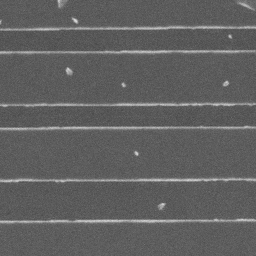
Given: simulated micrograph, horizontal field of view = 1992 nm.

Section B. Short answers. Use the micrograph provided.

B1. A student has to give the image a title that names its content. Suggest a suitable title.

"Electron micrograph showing lines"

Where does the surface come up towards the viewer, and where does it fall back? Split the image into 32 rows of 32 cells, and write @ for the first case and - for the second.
@@@@@@@@@@@@@@@@@@@@@@@@@@@@@@@@
@@@@@@@@@@@@@@@@@@@@@@@@@@@@@@@@
@@@@@@@@@@@@@@@@@@@@@@@@@@@@@@@@
@@@@@@@@@@@@@@@@@@@@------------
--------------------------------
--------------------------------
--------------------@@@@@@@@@@@@
@@@@@@@@@@@@@@@@@@@@@@@@@@@@@@@@
@@@@@@@@@@@@@@@@@@@@@@@@@@@@@@@@
@@@@@@@@@@@@@@@@@@@@@@@@@@@@@@@@
@@@@@@@@@@@@@@@@@@@@@@@@@@@@@@@@
@@@@@@@@@@@@@@@@@@@@@@@@@@@@@@@@
@@@@@@@@@@@@@@@@@@@@@@@@@@@@@@@@
--------------------------------
--------------------------------
--------------------------------
@@@@@@@@@@@@@@@@@@@@@@@@@@@@@@@@
@@@@@@@@@@@@@@@@@@@@@@@@@@@@@@@@
@@@@@@@@@@@@@@@@@@@@@@@@@@@@@@@@
@@@@@@@@@@@@@@@@@@@@@@@@@@@@@@@@
@@@@@@@@@@@@@@@@@@@@@@@@@@@@@@@@
@@@@@@@@@@@@@@@@@@@@@@@@@@@@@@@@
@@@@@@@@@@@@@@@@@@@@@@@@@-------
--------------------------------
--------------------------------
--------------------------------
--------------------------------
------------------------------@-
@@@@@@@@@@@@@@@@@@@@@@@@@@@@@@@@
@@@@@@@@@@@@@@@@@@@@@@@@@@@@@@@@
@@@@@@@@@@@@@@@@@@@@@@@@@@@@@@@@
@@@@@@@@@@@@@@@@@@@@@@@@@@@@@@@@